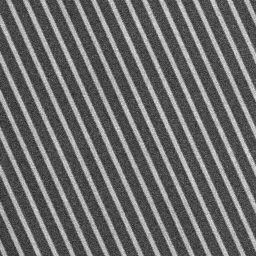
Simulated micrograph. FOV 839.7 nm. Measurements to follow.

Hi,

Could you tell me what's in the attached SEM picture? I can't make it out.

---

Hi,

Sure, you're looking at parallel lines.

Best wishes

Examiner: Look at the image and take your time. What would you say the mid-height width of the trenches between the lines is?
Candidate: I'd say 37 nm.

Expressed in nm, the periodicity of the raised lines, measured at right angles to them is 50.8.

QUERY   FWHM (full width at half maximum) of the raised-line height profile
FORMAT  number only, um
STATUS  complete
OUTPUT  0.0142